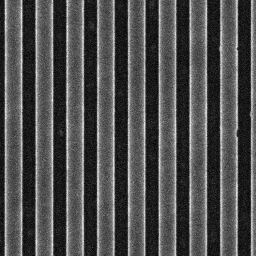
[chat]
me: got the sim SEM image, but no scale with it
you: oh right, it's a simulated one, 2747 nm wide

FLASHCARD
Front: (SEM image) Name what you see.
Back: parallel lines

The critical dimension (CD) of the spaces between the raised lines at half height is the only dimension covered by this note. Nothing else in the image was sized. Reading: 150 nanometres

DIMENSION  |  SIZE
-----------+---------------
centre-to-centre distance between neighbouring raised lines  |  330 nm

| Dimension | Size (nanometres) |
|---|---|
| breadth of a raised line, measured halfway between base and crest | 181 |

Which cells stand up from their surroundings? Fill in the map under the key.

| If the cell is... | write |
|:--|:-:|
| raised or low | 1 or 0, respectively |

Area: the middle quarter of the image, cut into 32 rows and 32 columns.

01111000111100001111000011110000
01111000111100001111000011110000
01111000111100001111000011110000
01111000111100001111000011110000
01111000111100001111000011110000
01111000111100001111000011110000
01111000111100001111000011110000
01111000111100001111000011110000
01111000111100001111000011110000
01111000111100001111000011110000
01111000111100001111000011110000
01111000111100001111000011110000
01111000111100001111000011110000
01111000111100001111000011110000
01111000111100001111000011110000
01111000111100001111000011110000
01111000111100001111000011110000
01111000111100001111000011110000
01111000111100001111000011110000
01111000111100001111000011110000
01111000111100001111000011110000
01111000111100001111000011110000
01111000111100001111000011110000
01111000111100001111000011110000
01111000111100001111000011110000
01111000111100001111000011110000
01111000111100001111000011110000
01111000111100001111000011110000
01111000111100001111000011110000
01111000111100001111000011110000
01111000111100001111000011110000
01111000111100001111000011110000